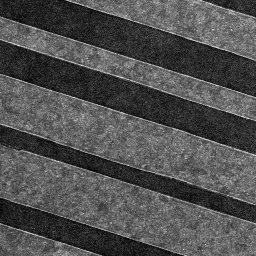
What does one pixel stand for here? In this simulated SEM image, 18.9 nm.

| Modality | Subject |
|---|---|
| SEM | one or a few lines or trenches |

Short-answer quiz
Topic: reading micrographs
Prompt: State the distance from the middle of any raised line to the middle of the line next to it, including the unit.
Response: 1.28 micrometres